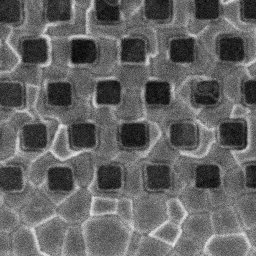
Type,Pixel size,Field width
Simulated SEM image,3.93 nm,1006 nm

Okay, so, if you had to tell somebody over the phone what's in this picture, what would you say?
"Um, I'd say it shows a regular array of raised bodies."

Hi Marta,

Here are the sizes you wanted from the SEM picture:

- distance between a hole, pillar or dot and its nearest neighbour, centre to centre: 0.188 microns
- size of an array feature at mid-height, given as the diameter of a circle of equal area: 0.115 micrometres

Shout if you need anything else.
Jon